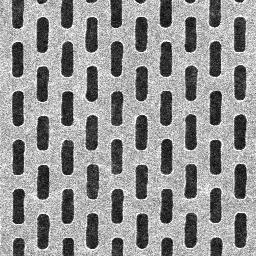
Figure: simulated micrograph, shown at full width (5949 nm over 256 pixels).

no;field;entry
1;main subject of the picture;a regular array of holes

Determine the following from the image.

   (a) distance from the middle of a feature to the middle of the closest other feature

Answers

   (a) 798 nm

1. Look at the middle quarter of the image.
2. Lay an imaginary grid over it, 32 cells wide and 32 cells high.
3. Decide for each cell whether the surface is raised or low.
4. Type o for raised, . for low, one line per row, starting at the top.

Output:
...ooooooooo...oooo.oooo...oooo.
...ooo...ooo..oooo...ooo...ooo..
..ooo....ooo..oooo...ooo...ooo..
ooooo....ooooooooo...ooooooooo..
ooooo....ooooooooo...ooooooooo..
ooooo....ooooooooo...ooooooooo..
ooooo....ooooooooo...ooooooooo..
..ooo....ooo...ooo...ooo...ooo..
...oo...oooo...ooo...ooo...ooo..
...ooo.ooooo...oooo.oooo...ooooo
...ooooooooo...ooooooooo...ooooo
...ooooooooo...ooooooooo...ooooo
...ooooooooo...ooooooooo...oooo.
...ooo..oooo...ooo...ooo...ooo..
..ooo....ooo...ooo...ooo...ooo..
.oooo....oooo.oooo...oooo.oooo..
ooooo....ooooooooo...ooooooooo..
ooooo....ooooooooo...ooooooooo..
ooooo....ooooooooo...ooooooooo..
..ooo....ooo...ooo...ooo...ooo..
...oo...oooo...ooo...ooo...ooo..
...ooo..oooo...ooo..oooo...oooo.
...ooooooooo...ooooooooo...ooooo
...ooooooooo...ooooooooo...ooooo
...ooooooooo...ooooooooo...ooooo
...ooo...ooo...ooo...ooo...ooo..
..oooo...ooo...ooo...ooo...ooo..
..oooo...ooo..oooo...oooo..ooo..
oooooo...ooooooooo...ooooooooo..
oooooo...ooooooooo...ooooooooo..
oooooo...ooooooooo...ooooooooo..
..oooo...ooo...ooo...oooo..ooo..